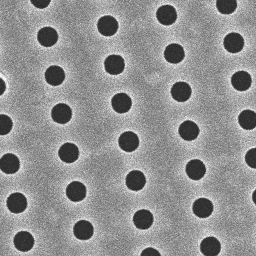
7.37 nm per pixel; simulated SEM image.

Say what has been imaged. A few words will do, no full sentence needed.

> a regular array of holes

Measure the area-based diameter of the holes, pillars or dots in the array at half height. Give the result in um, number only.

0.158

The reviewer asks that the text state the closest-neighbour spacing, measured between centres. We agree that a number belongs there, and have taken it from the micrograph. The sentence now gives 288 nm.